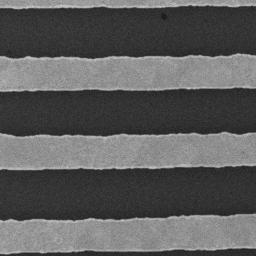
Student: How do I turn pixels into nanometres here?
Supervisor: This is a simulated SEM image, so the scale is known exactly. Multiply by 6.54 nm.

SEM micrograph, lines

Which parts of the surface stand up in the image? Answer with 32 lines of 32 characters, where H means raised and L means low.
HHHHHHHHHHHHHHHHHHHHHHHHHHHHHHHH
LLLLLLLLLLLLLLLLLLLLLLLLLLLLLLLL
LLLLLLLLLLLLLLLLLLLLLLLLLLLLLLLL
LLLLLLLLLLLLLLLLLLLLLLLLLLLLLLLL
LLLLLLLLLLLLLLLLLLLLLLLLLLLLLLLL
LLLLLLLLLLLLLLLLLLLLLLLLLLLLLLLL
LLLLLLLLLLLLLLLLLLLLLLLLLLLLLLLL
HHHHHHHHHHHHHHHHHHHHHHHHHHHHHHHH
HHHHHHHHHHHHHHHHHHHHHHHHHHHHHHHH
HHHHHHHHHHHHHHHHHHHHHHHHHHHHHHHH
HHHHHHHHHHHHHHHHHHHHHHHHHHHHHHHH
LLLLLLLLLLLLLLLLLLLLLLLLLLLLLLLL
LLLLLLLLLLLLLLLLLLLLLLLLLLLLLLLL
LLLLLLLLLLLLLLLLLLLLLLLLLLLLLLLL
LLLLLLLLLLLLLLLLLLLLLLLLLLLLLLLL
LLLLLLLLLLLLLLLLLLLLLLLLLLLLLLLL
LLLLLLLLLLLLLLLLLLLLLLLLLLLLLLLL
HHHHHHHHHHHHHHHHHHHHHHHHHHHHHHHH
HHHHHHHHHHHHHHHHHHHHHHHHHHHHHHHH
HHHHHHHHHHHHHHHHHHHHHHHHHHHHHHHH
HHHHHHHHHHHHHHHHHHHHHHHHHHHHHHHH
LLLLLLLLLLLLLLLLLLLLLLLLLLLLLLLL
LLLLLLLLLLLLLLLLLLLLLLLLLLLLLLLL
LLLLLLLLLLLLLLLLLLLLLLLLLLLLLLLL
LLLLLLLLLLLLLLLLLLLLLLLLLLLLLLLL
LLLLLLLLLLLLLLLLLLLLLLLLLLLLLLLL
LLLLLLLLLLLLLLLLLLLLLLLLLLLLLLLL
LHLHHHLLLLHHHHHHHHHHHHHHHHHHHHHH
HHHHHHHHHHHHHHHHHHHHHHHHHHHHHHHH
HHHHHHHHHHHHHHHHHHHHHHHHHHHHHHHH
HHHHHHHHHHHHHHHHHHHHHHHHHHHHHHHH
HHHLLHLLLLLLLLLLLLLLLLLLLLLLLLLL